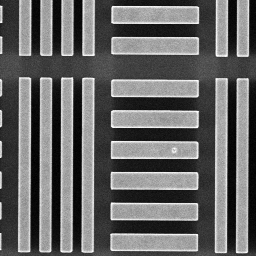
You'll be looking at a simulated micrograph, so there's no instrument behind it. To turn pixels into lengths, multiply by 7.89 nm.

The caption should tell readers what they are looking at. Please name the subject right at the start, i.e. groups of lines, slits or small figures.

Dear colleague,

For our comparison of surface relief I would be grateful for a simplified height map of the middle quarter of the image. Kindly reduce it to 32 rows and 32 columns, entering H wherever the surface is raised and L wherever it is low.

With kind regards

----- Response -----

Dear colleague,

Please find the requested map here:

LLLLLLLLLLLLLLLLLLLLLLLLLLLLLLLL
LLLLLLLLLLLLLLLLLLLLLLLLLLLLLLLL
LLLLLLLLLLLLLLLLLLLLLLLLLLLLLLLL
HHLLLHHLLLLLLLLLLLLLLLLLLLLLLLLL
HHLLLHHHLLLLHHHHHHHHHHHHHHHHHHHH
HHLLLHHHLLLLHHHHHHHHHHHHHHHHHHHH
HHLLLHHHLLLLHHHHHHHHHHHHHHHHHHHH
HHLLLHHHLLLLHHHHHHHHHHHHHHHHHHHH
HHLLLHHHLLLLLLLLLLLLLLLLLLLLLLLL
HHLLLHHHLLLLLLLLLLLLLLLLLLLLLLLL
HHLLLHHHLLLLLLLLLLLLLLLLLLLLLLLL
HHLLLHHHLLLLLLLLLLLLLLLLLLLLLLLL
HHLLLHHHLLLLHHHHHHHHHHHHHHHHHHHH
HHLLLHHHLLLLHHHHHHHHHHHHHHHHHHHH
HHLLLHHHLLLLHHHHHHHHHHHHHHHHHHHH
HHLLLHHHLLLLHHHHHHHHHHHHHHHHHHHH
HHLLLHHHLLLLLLLLLLLLLLLLLLLLLLLL
HHLLLHHHLLLLLLLLLLLLLLLLLLLLLLLL
HHLLLHHHLLLLLLLLLLLLLLLLLLLLLLLL
HHLLLHHHLLLLHHHHHHHHHHHHHHHHLLLL
HHLLLHHLLLLLHHHHHHHHHHHHHHHHHHHH
HHLLLHHLLLLLHHHHHHHHHHHHHHHHHHHH
HHLLLHHLLLLLHHHHHHHHHHHHHHHHHHHH
HHLLLHHLLLLLHHHHHHHHHHHHHHHHHHHH
HHLLLHHLLLLLLLLLLLLLLLLLLLLLLLLL
HHLLLHHLLLLLLLLLLLLLLLLLLLLLLLLL
HHLLLHHLLLLLLLLLLLLLLLLLLLLLLLLL
HHLLLHHLLLLLHHHHHHHHHHHHHHHHHHHH
HHLLLHHLLLLLHHHHHHHHHHHHHHHHHHHH
HHLLLHHLLLLLHHHHHHHHHHHHHHHHHHHH
HHLLLHHLLLLLHHHHHHHHHHHHHHHHHHHH
HHLLLHHLLLLLLLLLLLLLLLLLLLLLLLLL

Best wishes